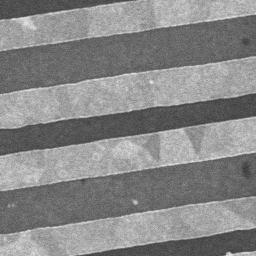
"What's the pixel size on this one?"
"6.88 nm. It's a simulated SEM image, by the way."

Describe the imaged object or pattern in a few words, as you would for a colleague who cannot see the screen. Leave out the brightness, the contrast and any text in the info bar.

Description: lines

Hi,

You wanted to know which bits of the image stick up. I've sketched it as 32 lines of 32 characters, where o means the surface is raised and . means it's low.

..............oooooooooooooooooo
........oooooooooooooooooooooooo
ooooooooooooooooooooooooooo.....
oooooooooooooooooooo............
ooooooooooooo...................
oooooo..........................
................................
.............................ooo
......................oooooooooo
...............ooooooooooooooooo
.........ooooooooooooooooooooooo
..oooooooooooooooooooooooooooooo
oooooooooooooooooooooooooo......
oooooooooooooooooo..............
oooooooooooo....................
ooooo.....................oooooo
....................oooooooooooo
.............ooooooooooooooooooo
.......ooooooooooooooooooooooooo
ooooooooooooooooooooooooooooo...
oooooooooooooooooooooo..........
oooooooooooooooo................
ooooooooo.......................
ooo.............................
................................
........................oooooooo
..................oooooooooooooo
............oooooooooooooooooooo
......oooooooooooooooooooooooooo
oooooooooooooooooooooooooo......
oooooooooooooooooo..............
oooooooooooo...................o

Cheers